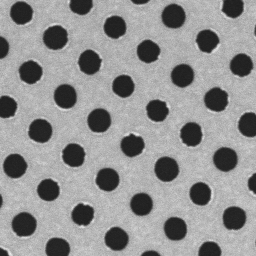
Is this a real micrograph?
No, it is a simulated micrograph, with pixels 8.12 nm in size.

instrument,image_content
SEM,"a regular array of holes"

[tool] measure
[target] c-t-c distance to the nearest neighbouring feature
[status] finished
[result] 0.338 µm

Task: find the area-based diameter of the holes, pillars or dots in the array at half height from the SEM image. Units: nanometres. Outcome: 192